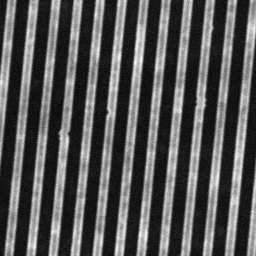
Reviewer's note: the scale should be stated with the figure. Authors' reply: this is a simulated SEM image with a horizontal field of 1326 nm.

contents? parallel lines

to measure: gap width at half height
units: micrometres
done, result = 0.0799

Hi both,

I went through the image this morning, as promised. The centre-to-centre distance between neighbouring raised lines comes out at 114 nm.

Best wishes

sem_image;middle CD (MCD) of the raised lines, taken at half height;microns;0.0355